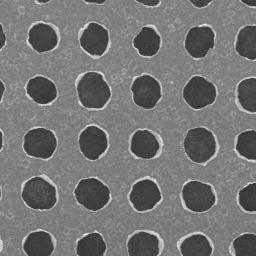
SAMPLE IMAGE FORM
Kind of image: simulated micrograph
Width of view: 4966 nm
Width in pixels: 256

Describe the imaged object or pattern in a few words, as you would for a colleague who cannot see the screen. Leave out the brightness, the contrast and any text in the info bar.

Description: a regular array of holes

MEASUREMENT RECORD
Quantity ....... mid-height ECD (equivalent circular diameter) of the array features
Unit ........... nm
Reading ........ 611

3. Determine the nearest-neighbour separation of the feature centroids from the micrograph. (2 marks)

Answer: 994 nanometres